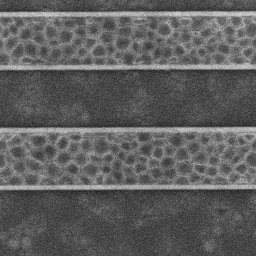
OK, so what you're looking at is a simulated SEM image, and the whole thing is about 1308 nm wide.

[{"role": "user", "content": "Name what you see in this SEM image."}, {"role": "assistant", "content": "one or a few lines or trenches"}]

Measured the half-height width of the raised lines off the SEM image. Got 280 nanometres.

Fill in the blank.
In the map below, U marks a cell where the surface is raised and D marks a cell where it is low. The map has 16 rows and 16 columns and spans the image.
DDDDDDDDDDDDDDDD
UUUUUUUUUUUUUUUU
UUUUUUUUUUUUUUUU
UUUUUUUUUUUUUUUU
DDDDDDDDDDDDDDDD
DDDDDDDDDDDDDDDD
DDDDDDDDDDDDDDDD
DDDDDDDDDDDDDDDD
UUUUUUUUUUUUUUUU
UUUUUUUUUUUUUUUU
UUUUUUUUUUUUUUUU
UUUUUUUUUUUUUUUU
DDDDDDDDDDDDDDDD
DDDDDDDDDDDDDDDD
DDDDDDDDDDDDDDDD
DDDDDDDDDDDDDDDD